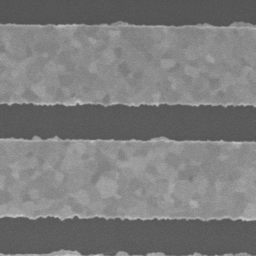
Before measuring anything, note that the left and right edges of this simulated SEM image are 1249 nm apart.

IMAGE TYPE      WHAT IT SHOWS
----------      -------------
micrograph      lines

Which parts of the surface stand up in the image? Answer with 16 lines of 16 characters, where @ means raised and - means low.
----------------
----------------
@@@@@@@@@@@@@@@@
@@@@@@@@@@@@@@@@
@@@@@@@@@@@@@@@@
@@@@@@@@@@@@@@@@
--@@@@@@@@@@@@@@
----------------
----------------
@@@@@@@@@@@@@@@@
@@@@@@@@@@@@@@@@
@@@@@@@@@@@@@@@@
@@@@@@@@@@@@@@@@
@@@@@@@@@@@@@@@@
----------------
----------------